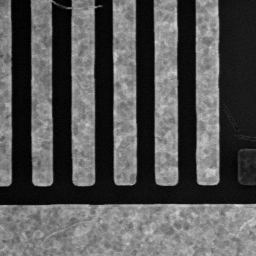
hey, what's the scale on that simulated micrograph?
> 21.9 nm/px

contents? wiring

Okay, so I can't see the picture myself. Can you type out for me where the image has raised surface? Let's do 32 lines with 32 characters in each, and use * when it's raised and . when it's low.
*...**...***..***..***..***.....
*...**...***..***..***..***.....
*...**...***..***..***..***.....
*...**...***..***..***..***.....
*...**...***..***..***..***.....
*...**...***..***..***..***.....
*...**...***..***..***..***.....
*...**...***..***..***...**.....
*...**...***..***..***...**.....
*...**...***..***..***...**.....
*...**...***..***..***...**.....
*...**...***..***..***...**.....
*...**...***..***..***...**.....
*...**...***..***..***...**.....
*...**...***..***..***...**.....
*...**...***..***..***...**.....
*...**...***..***..***...**.....
*...**...***..***..***...**.....
*...**...***..***..***...**.....
*...**...***..***..***...**...**
*...**...***..***..***...**...**
*...***..***..***..***...**...**
*...***..***..***..***...**...**
................................
................................
................................
********************************
********************************
********************************
********************************
********************************
********************************